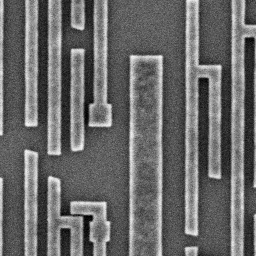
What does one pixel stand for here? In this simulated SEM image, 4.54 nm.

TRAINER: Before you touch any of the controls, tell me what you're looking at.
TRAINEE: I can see wiring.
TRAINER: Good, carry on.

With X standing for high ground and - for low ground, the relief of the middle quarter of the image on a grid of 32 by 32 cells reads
--XXX---XX-------XXXXXXX-------X
--XXX---XX-------XXXXXXX-------X
--XXX---XX-------XXXXXXX-------X
--XXX---XX-------XXXXXXX-------X
--XXX---XX-------XXXXXXX-------X
--XXX---XX-------XXXXXXX-------X
--XXX---XX-------XXXXXXX-------X
--XXX---XX-------XXXXXXX-------X
--XXX---XX-------XXXXXXX-------X
--XXX---XX-------XXXXXXX-------X
--XXX--XXXXX-----XXXXXXX-------X
--XXX--XXXXX-----XXXXXXX-------X
--XXX--XXXXX-----XXXXXXX-------X
--XXX-XXXXXX-----XXXXXXX-------X
--XXX-XXXXXX-----XXXXXXX-------X
--XXX------------XXXXXXX-------X
--XXX------------XXXXXXX-------X
--XXX------------XXXXXXX-------X
--XXX------------XXXXXXX-------X
--XXX------------XXXXXXX-------X
--XXX------------XXXXXXX-------X
--XX-------------XXXXXXX-------X
-----------------XXXXXXX-------X
-----------------XXXXXXX-------X
-----------------XXXXXXX-------X
-----------------XXXXXXX-------X
-----------------XXXXXXX-------X
-----------------XXXXXXX-------X
-----------------XXXXXXX-------X
-----------------XXXXXXX-------X
-----------------XXXXXXX-------X
-----------------XXXXXXX-------X